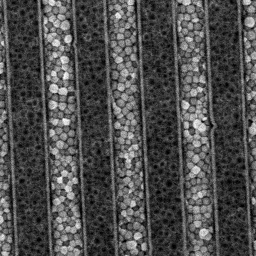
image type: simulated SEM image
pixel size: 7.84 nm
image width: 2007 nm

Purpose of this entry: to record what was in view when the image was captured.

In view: one or a few lines or trenches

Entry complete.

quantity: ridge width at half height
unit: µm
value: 0.258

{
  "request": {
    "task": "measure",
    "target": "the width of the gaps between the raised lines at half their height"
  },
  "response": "0.264 um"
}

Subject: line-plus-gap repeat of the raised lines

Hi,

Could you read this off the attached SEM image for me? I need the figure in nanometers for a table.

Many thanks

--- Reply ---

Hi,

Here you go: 523